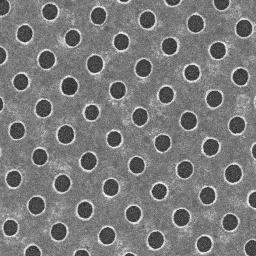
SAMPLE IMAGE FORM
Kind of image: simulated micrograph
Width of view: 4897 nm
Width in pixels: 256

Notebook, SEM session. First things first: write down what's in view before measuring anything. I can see a regular array of holes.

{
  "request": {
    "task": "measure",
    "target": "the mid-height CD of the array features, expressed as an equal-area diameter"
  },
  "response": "0.33 micrometres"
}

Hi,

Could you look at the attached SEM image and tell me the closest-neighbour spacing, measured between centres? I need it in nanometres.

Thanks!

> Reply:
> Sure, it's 651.